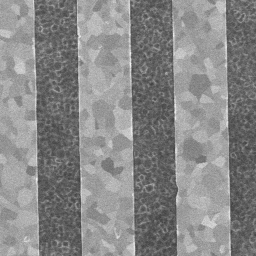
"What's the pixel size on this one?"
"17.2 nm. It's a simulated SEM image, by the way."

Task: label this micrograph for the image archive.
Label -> one or a few lines or trenches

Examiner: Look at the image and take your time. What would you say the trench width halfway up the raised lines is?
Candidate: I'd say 0.738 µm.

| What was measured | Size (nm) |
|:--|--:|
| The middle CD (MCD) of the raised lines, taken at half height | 906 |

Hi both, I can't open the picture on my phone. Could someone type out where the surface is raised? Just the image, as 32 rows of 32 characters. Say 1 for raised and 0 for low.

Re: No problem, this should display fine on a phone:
11110000001111110000001111110000
11110000001111110000001111110000
11110000001111110000001111110000
11110000001111110000001111110000
11110000001111110000001111110000
11110000001111110000001111110000
11110000001111110000001111110000
11110000001111110000001111110000
11110000001111110000001111110000
11110000001111110000001111110000
11110000001111110000001111110000
11110000001111110000001111110000
11110000001111110000001111110000
11110000001111110000001111110000
11110000001111110000001111110000
11111000001111110000001111110000
11111000001111110000001111110000
11111000001111111000001111111000
11111000001111111000001111111000
11111001001111111000001111111000
11111000001111111010001111111000
11111000001111111000001111111000
11111000001111111000001111111000
11111000001111111000001111111000
11111000001111111000001111111000
11111000001111111000001111111000
11111000001111111000101111111000
11111000001111111000001111111000
11111000001111111000001111111000
11111000001111111000001111111000
11111000001111111000001111111000
11111000001111111000001111111000